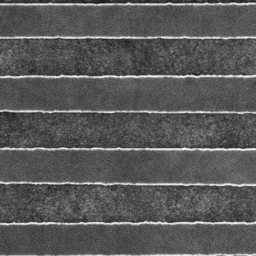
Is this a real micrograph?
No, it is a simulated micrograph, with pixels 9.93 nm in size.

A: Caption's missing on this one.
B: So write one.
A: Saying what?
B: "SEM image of lines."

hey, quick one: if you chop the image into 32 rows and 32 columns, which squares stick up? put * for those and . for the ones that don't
...............**...**...*.*****
********************************
********************************
********************************
********************************
................................
................................
................................
................................
.......*..................*....*
********************************
********************************
********************************
********************************
................................
................................
................................
................................
................................
********************************
********************************
********************************
********************************
................................
................................
................................
................................
................................
********************************
********************************
********************************
********************************